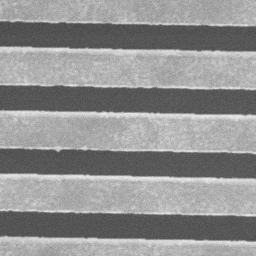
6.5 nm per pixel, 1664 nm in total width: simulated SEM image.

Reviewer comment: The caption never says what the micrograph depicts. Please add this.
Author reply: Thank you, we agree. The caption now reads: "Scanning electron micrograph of lines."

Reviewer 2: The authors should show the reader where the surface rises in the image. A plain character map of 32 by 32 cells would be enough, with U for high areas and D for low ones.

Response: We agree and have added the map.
UUUUUUUUUUUUUUUUUUUUUUUUUUUUUUUU
UUUUUUUUUUUUUUUUUUUUUUUUUUUUUUUU
UUUUUUUUUUUUUUUUUUUUUUUUUUUUUUUU
DDDDDDDDDDDDDDDDDDDDDDDDDDDDDDDD
DDDDDDDDDDDDDDDDDDDDDDDDDDDDDDDD
DDDDDDDDDDDDDDDDDDDDDDDDDDDDDDDD
UUUUUUUUUUUUUUDDDDDDDDDDDDDDDDDD
UUUUUUUUUUUUUUUUUUUUUUUUUUUUUUUU
UUUUUUUUUUUUUUUUUUUUUUUUUUUUUUUU
UUUUUUUUUUUUUUUUUUUUUUUUUUUUUUUU
DUUUUUUUUUUUUUUUUUUUUUUUUUUUUUUU
DDDDDDDDDDDDDDDDDDDDDDDDDDDDDDDD
DDDDDDDDDDDDDDDDDDDDDDDDDDDDDDDD
DDDDDDDDDDDDDDDDDDDDDDDDDDDDDDDD
UUUUUUUUUUUUUUUUUUUUDDDDDDDDDDDD
UUUUUUUUUUUUUUUUUUUUUUUUUUUUUUUU
UUUUUUUUUUUUUUUUUUUUUUUUUUUUUUUU
UUUUUUUUUUUUUUUUUUUUUUUUUUUUUUUU
DDDDDUUUUUUUUUUUUUUUUUUUUUUUUUUU
DDDDDDDDDDDDDDDDDDDDDDDDDDDDDDDD
DDDDDDDDDDDDDDDDDDDDDDDDDDDDDDDD
DDDDDDDDDDDDDDDDDDDDDDDDDDDDDDDD
UUUUUUUUUUUUUUUUUUUUUUUDUDDDDDDD
UUUUUUUUUUUUUUUUUUUUUUUUUUUUUUUU
UUUUUUUUUUUUUUUUUUUUUUUUUUUUUUUU
UUUUUUUUUUUUUUUUUUUUUUUUUUUUUUUU
DDDDDDDDDDDDDDUUUUUUUUUUUUUUUUUU
DDDDDDDDDDDDDDDDDDDDDDDDDDDDDDDD
DDDDDDDDDDDDDDDDDDDDDDDDDDDDDDDD
DDDDDDDDDDDDDDDDDDDDDDDDDDDDDDDD
UUUUUUUUUUUUUUUUUUUUUUUUUUUUUUUU
UUUUUUUUUUUUUUUUUUUUUUUUUUUUUUUU